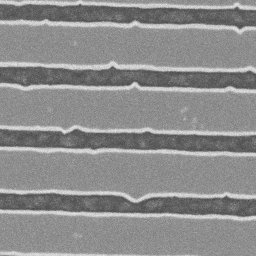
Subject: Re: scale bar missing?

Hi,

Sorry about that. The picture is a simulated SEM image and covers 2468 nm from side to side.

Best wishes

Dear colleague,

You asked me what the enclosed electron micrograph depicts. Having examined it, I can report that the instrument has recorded parallel lines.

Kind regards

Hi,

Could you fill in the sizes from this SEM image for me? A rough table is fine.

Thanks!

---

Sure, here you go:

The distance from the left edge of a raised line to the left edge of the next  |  610 nanometers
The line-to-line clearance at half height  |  200 nanometers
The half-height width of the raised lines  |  410 nm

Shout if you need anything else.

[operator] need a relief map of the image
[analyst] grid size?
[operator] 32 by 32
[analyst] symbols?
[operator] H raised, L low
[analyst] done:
LLLLLLLLLLLLLHHHHHHHHHHHHHHHHHHH
LLLLLLLLLLLLLLLLLLLLLLLLLLLLLLLL
LLLLLLLLLLLLLLLLLLLLLLLLLLLLLLLL
HHHHHHHHHHHHHHHHHHHHHHHHHHHHHLLL
HHHHHHHHHHHHHHHHHHHHHHHHHHHHHHHH
HHHHHHHHHHHHHHHHHHHHHHHHHHHHHHHH
HHHHHHHHHHHHHHHHHHHHHHHHHHHHHHHH
HHHHHHHHHHHHHHHHHHHHHHHHHHHHHHHH
LLLLLLLLLLLLLLLLLLLHHHHHHHHHHHHH
LLLLLLLLLLLLLLLLLLLLLLLLLLLLLLLL
LLLLLLLLLLLLLLLLLLLLLLLLLLLLLLLL
HHHHHHHHHHHHHHHHHHHHHHHHHHHHHHHH
HHHHHHHHHHHHHHHHHHHHHHHHHHHHHHHH
HHHHHHHHHHHHHHHHHHHHHHHHHHHHHHHH
HHHHHHHHHHHHHHHHHHHHHHHHHHHHHHHH
HHHHHHHHHHHHHHHHHHHHHHHHHHHHHHHH
LLLLLLLLLLLLLLLLLLLLHHHHHHHHHHHH
LLLLLLLLLLLLLLLLLLLLLLLLLLLLLLLL
LLLLLLLLLLLLLLLLLLLLLLLLLLLLLLLL
HHHHHHHHHHHHHHHHHHHHHHHHHHHHHHHH
HHHHHHHHHHHHHHHHHHHHHHHHHHHHHHHH
HHHHHHHHHHHHHHHHHHHHHHHHHHHHHHHH
HHHHHHHHHHHHHHHHHHHHHHHHHHHHHHHH
HHHHHHHHHHHHHHHHHHHHHHHHHHHHHHHH
LLLLLLLLLLLLLLLLHHHLLLLLLHHLLHHH
LLLLLLLLLLLLLLLLLLLLLLLLLLLLLLLL
HLLHLLLLLLLLLLLLLLLLLLLLLLLLLLLL
HHHHHHHHHHHHHHHHHHHHHHHHHHHHHHHH
HHHHHHHHHHHHHHHHHHHHHHHHHHHHHHHH
HHHHHHHHHHHHHHHHHHHHHHHHHHHHHHHH
HHHHHHHHHHHHHHHHHHHHHHHHHHHHHHHH
HHHHHHHHHHHHHHHHHHHHHHHHHHHHHHHH